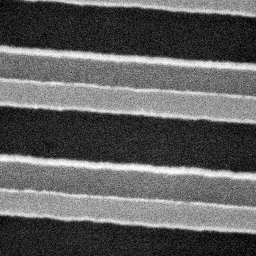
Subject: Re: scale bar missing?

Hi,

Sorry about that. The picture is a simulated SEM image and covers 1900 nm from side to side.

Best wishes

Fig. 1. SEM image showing lines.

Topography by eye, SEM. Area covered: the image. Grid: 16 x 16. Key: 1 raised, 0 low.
0000000000111111
0000000000000000
0000000000000000
1111110000000000
1111111111111111
1111111111111111
1111111111111111
0000000000000111
0000000000000000
0000000000000000
1111111100000000
1111111111111111
1111111111111111
0011111111111111
0000000000000001
0000000000000000